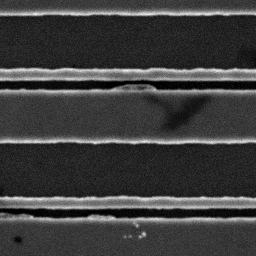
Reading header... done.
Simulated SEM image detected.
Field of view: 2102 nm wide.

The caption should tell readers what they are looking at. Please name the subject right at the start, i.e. lines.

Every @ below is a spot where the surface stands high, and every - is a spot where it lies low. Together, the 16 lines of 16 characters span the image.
@@@@@@@@@@@@@@@@
----------------
----------------
----------------
@@@@@@@@@@@@@@@@
@@@@@@@@@@@@@@@@
@@@@@@@@@@@@@@@@
@@@@@@@@@@@@@@@@
@@@@@@@@@@@@@@@@
----------------
----------------
----------------
@@@@@@@@@@@@@@@@
@@@@@@@@@@@@@@@@
@@@@@@@@@@@@@@@@
@@@@@@@@@@@@@@@@